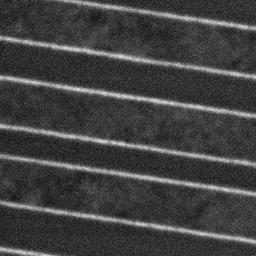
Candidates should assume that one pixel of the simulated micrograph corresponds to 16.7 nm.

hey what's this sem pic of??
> lines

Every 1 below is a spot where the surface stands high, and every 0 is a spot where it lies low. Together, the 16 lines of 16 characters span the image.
1111111100000000
1111111111111100
0111111111111111
0000000111111111
0000000000000111
1111100000000000
1111111111100000
1111111111111111
0000111111111111
0000000000111111
1111100000000000
1111111111110000
1111111111111111
0000011111111111
0000000000001111
0000000000000000